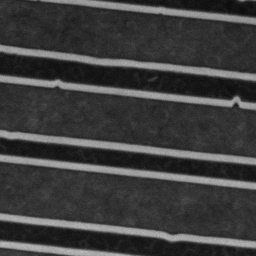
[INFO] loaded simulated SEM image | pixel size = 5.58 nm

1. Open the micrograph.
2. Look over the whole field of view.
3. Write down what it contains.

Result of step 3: one or a few lines or trenches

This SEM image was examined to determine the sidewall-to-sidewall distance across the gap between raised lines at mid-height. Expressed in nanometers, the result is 312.